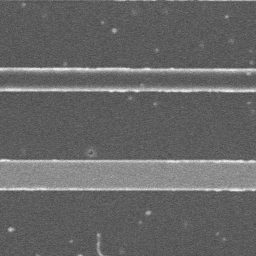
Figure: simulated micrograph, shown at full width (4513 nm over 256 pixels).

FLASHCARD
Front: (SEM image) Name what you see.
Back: lines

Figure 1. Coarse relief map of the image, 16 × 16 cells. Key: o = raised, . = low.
................
................
................
................
oooooooooooooooo
oooooooooooooooo
................
................
................
................
oooooooooooooooo
oooooooooooooooo
................
................
................
................